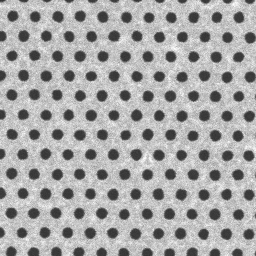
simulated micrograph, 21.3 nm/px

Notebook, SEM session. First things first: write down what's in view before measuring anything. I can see a regular array of holes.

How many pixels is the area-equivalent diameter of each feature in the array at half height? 11.6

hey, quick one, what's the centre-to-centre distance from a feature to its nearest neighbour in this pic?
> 472 nm